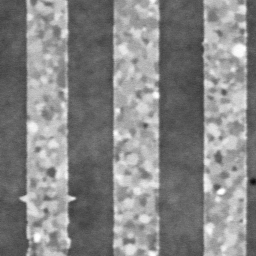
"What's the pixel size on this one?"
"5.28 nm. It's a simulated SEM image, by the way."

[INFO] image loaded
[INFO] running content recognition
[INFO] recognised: one or a few lines or trenches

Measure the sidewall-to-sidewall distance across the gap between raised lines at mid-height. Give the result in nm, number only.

246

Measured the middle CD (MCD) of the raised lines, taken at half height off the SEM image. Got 219 nm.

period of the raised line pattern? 470 nanometres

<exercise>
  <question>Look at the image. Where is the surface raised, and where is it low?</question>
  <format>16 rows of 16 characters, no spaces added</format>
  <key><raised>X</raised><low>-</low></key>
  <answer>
--XX---XXX---XX-
--XX---XXX---XX-
--XX---XXX---XX-
--XX---XXX---XX-
--XX---XXX---XX-
--XX---XXX---XX-
--XX---XXX---XX-
--XX---XXX---XX-
--XX---XXX---XX-
--XX---XXX---XX-
--XX---XXX---XX-
--XX---XXX---XX-
--XX---XXX---XX-
--XX---XXX---XX-
--XX---XXX---XX-
--XX---XXX---XX-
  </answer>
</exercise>